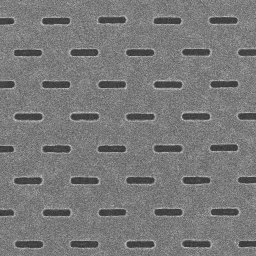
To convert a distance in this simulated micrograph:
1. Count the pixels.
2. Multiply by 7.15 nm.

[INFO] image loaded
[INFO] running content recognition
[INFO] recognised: a regular array of holes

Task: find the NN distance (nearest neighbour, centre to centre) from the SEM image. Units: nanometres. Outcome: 301